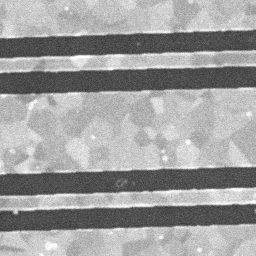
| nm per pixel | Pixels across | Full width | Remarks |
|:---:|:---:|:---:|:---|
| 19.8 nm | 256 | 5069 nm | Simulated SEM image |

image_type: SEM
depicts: lines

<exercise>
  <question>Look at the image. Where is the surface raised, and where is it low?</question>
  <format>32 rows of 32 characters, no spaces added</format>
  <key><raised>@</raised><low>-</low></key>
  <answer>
@@@@@@@@@@@@@@@@@@@@@@@@@@@@@@@@
@@@@@@@@@@@@@@@@@@@@@@@@@@@@@@@@
@@@@@@@@@@@@@@@@@@@@@@@@@@@@@@@@
@@@@@@@@@@@@@@@@@@@@@@@@@@@@@@@@
@@@@@@--------------------------
--------------------------------
----------------------------@@@@
@@@@@@@@@@@@@@@@@@@@@@@@@@@@@@@@
@@@@@@@@@@@@@@@@@@@-------------
--------------------------------
--------------------------------
------------------@@@@@@@@@@@@@@
@@@@@@@@@@@@@@@@@@@@@@@@@@@@@@@@
@@@@@@@@@@@@@@@@@@@@@@@@@@@@@@@@
@@@@@@@@@@@@@@@@@@@@@@@@@@@@@@@@
@@@@@@@@@@@@@@@@@@@@@@@@@@@@@@@@
@@@@@@@@@@@@@@@@@@@@@@@@@@@@@@@@
@@@@@@@@@@@@@@@@@@@@@@@@@@@@@@@@
@@@@@@@@@@@@@@@@@@@@@@@@@@@@@@@@
@@@@@@@@@@@@@@@@@@@@@@@@@@@@@@@@
@@@@@@@@@@@@@@@@@@@@@@@@@@@@@@@@
@@@@@---------------------------
--------------------------------
--------------------------------
----@@@@@@@@@@@@@@@@@@@@@@@@@@@@
@@@@@@@@@@@@@@@@@@@@@@@@@@@@@---
--------------------------------
--------------------------------
-----------------@@@@@@@@@@@@@@@
@@@@@@@@@@@@@@@@@@@@@@@@@@@@@@@@
@@@@@@@@@@@@@@@@@@@@@@@@@@@@@@@@
@@@@@@@@@@@@@@@@@@@@@@@@@@@@@@@@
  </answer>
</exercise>